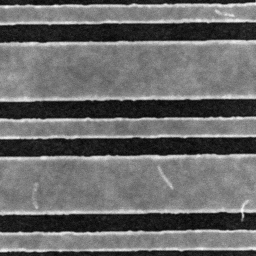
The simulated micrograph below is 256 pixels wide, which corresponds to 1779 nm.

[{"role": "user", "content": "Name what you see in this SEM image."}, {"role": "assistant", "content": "lines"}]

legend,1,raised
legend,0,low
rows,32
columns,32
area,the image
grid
00000000000000000000000000000001
11111111111111111111111111111111
11111111111111111111111111111111
00000000000000000000000000000000
00000000000000000000000000000000
11111111111111111111111111111111
11111111111111111111111111111111
11111111111111111111111111111111
11111111111111111111111111111111
11111111111111111111111111111111
11111111111111111111111111111111
11111111111111111111111111111111
11111111111110000000000000000000
00000000000000000000000000000000
00000000000000000000000000000000
11111111111111111111111111111111
11111111111111111111111111111111
00000000000000000000000000000000
00000000000000000000000000000000
00000000000000000111011111111111
11111111111111111111111111111111
11111111111111111111111111111111
11111111111111111111111111111111
11111111111111111111111111111111
11111111111111111111111111111111
11111111111111111111111111111111
11111111111111111111111111111011
00000000000000000000000000000000
00000000000000000000000000000000
11111111111111111111111111111111
11111111111111111111111111111111
00000000000000000000000000000000